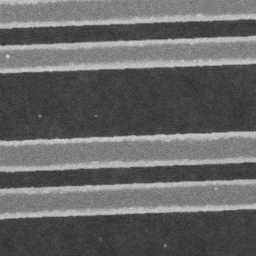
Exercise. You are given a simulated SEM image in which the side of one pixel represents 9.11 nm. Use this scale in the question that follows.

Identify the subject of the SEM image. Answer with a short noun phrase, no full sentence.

lines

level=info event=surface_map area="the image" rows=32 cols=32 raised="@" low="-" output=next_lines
@@@@@@@@@@@@@@@@@@@@@@@@@@@@@@@@
@@@@@@@@@@@@@@@@@@@@@@@@@@@@@@@@
@@@@@@@@@@@@@@@@@@@@@-----------
--------------------------------
--------------------------------
----------@@@@@@@@@@@@@@@@@@@@@@
@@@@@@@@@@@@@@@@@@@@@@@@@@@@@@@@
@@@@@@@@@@@@@@@@@@@@@@@@@@@@@@@@
@@@@@@@@@@@---------------------
--------------------------------
--------------------------------
--------------------------------
--------------------------------
--------------------------------
--------------------------------
--------------------------------
--------------------------------
-------@@@@@@@@@@@@@@@@@@@@@@@@@
@@@@@@@@@@@@@@@@@@@@@@@@@@@@@@@@
@@@@@@@@@@@@@@@@@@@@@@@@@@@@@@@@
@@@@@@@@@@@@@@@@@@@@@@----------
--------------------------------
--------------------------------
----------@@@@@@@@@@@@@@@@@@@@@@
@@@@@@@@@@@@@@@@@@@@@@@@@@@@@@@@
@@@@@@@@@@@@@@@@@@@@@@@@@@@@@@@@
@@@@@@@@@@@@@@@@@---------------
--------------------------------
--------------------------------
--------------------------------
--------------------------------
--------------------------------